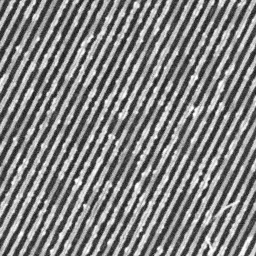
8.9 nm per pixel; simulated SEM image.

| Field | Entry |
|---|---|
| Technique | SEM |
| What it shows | parallel lines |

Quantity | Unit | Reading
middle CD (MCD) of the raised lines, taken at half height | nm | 30.8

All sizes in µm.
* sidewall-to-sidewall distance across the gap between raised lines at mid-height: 0.0517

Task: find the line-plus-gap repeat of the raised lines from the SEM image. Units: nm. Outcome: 83.4